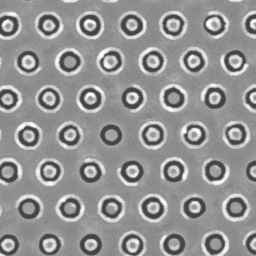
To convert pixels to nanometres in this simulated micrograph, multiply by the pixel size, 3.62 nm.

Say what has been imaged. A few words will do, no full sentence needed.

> a regular array of ring-shaped grooves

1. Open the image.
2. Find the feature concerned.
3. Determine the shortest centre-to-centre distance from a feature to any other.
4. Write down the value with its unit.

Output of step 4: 148 nm